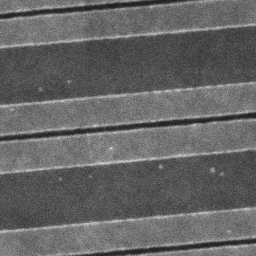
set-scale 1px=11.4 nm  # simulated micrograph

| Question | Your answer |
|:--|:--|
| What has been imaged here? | lines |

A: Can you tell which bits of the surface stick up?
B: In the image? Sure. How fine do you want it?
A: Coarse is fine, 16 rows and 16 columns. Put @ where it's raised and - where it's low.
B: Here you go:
@@@@@@@@@@@@@@@@
@@@@@@@@@@@@@@@@
@@@@@-----------
----------------
----------------
------------@@@@
--@@@@@@@@@@@@@@
@@@@@@@@@@@@@@@@
@@@@@@@@@@@@@@@@
@@@@@@@@@@@@@@@-
@@@-------------
----------------
----------------
-----------@@@@@
@@@@@@@@@@@@@@@@
@@@@@@@@@@@@@@@@